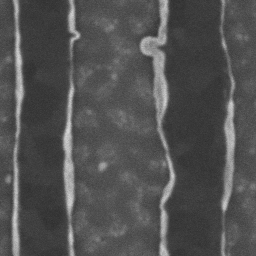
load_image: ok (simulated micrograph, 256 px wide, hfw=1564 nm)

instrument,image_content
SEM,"one or a few lines or trenches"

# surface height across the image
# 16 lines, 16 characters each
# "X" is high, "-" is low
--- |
-XXX------XXXX--
-XXXX-----XXXX--
-XXXX----XXXXX--
-XXX------XXXX--
-XXX------XXXX--
-XXX------XXXXX-
-XXX------XXXX--
-XXX------XXXX--
-XXX------XXXX--
-XXX------XXXXX-
-XXX-------XXXX-
-XXX-------XXX--
-XXX------XXXX--
-XXX------XXXX--
-XXX------XXXX--
-XXX------XXXX--